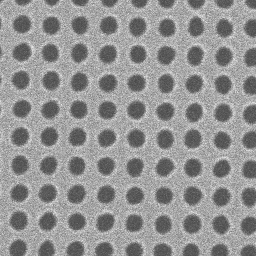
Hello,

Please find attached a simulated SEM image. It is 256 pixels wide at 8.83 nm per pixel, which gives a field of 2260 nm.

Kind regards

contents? a regular array of holes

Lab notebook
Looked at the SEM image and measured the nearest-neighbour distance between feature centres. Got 0.244 micrometres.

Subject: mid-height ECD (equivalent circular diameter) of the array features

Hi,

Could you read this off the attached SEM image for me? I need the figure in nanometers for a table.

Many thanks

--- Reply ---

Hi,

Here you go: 162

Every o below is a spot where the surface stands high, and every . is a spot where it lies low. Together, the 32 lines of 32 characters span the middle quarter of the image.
oooooooooooooooooooooooooooooooo
oooooooooooooooooooooooooooooooo
ooo..oooooooooooooooooooo.oooooo
oo....ooo....ooo....oooo...oooo.
oo....ooo....ooo....ooo.....oo..
oo....ooo....ooo....ooo.....oo..
oo...oooo...oooo....oooo...oooo.
oooooooooooooooooooooooooooooooo
oooooooooooooooooooooooooooooooo
ooo..ooooo..ooooo...oooooooooooo
oo....ooo....ooo....oooo...oooo.
o.....ooo....ooo....ooo.....ooo.
oo....ooo....ooo....ooo.....oo..
ooo..oooo...ooooo..ooooo...oooo.
oooooooooooooooooooooooooooooooo
oooooooooooooooooooooooooooooooo
oo...ooooo..ooooo..oooooo.ooooo.
o.....ooo....ooo....ooo....ooo..
o.....oo.....ooo....ooo.....oo..
o....oooo....ooo....ooo....ooo..
ooooooooo...ooooo..ooooo...oooo.
oooooooooooooooooooooooooooooooo
oooooooooooooooooooooooooooooooo
oo..ooooo...ooooo.oooooooooooooo
o....oooo....ooo....ooo....oooo.
o....ooo.....oo.....ooo.....oo..
o....ooo....oooo....ooo....ooo..
oo..ooooo...oooo...oooo...ooooo.
oooooooooooooooooooooooooooooooo
oooooooooooooooooooooooooooooooo
oo...ooooo..oooooooooooooooooooo
o....oooo....ooo...oooo....ooo..